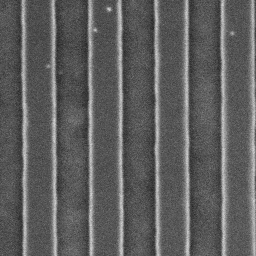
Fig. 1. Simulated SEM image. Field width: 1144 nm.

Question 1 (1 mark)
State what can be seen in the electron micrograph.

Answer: wiring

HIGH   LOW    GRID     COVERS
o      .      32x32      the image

...oooo....oooo....oooo.....oooo
...oooo....oooo....oooo.....oooo
...oooo....oooo....oooo.....oooo
...oooo....oooo....oooo.....oooo
...oooo....oooo....oooo.....oooo
...oooo....oooo....oooo.....oooo
...oooo....oooo....oooo.....oooo
...oooo....oooo....oooo.....oooo
...oooo....oooo....oooo.....oooo
...oooo....oooo....oooo.....oooo
...oooo....oooo....oooo.....oooo
...oooo....oooo....oooo.....oooo
...oooo....oooo.....ooo.....oooo
...oooo....oooo.....ooo.....oooo
...oooo....oooo.....ooo.....oooo
...oooo....oooo.....ooo.....oooo
...oooo....oooo.....ooo.....oooo
...oooo....oooo.....oooo....oooo
...oooo....oooo....ooooo....oooo
...oooo....oooo....oooo.....oooo
...oooo....oooo.....ooo.....oooo
...oooo....oooo.....oooo....oooo
...oooo....oooo.....oooo....oooo
...oooo....oooo.....oooo....oooo
...oooo....oooo.....oooo....oooo
...oooo....oooo.....oooo....oooo
...oooo....oooo.....oooo....oooo
...oooo....oooo.....oooo....oooo
...oooo....oooo.....oooo....oooo
...oooo....oooo.....oooo....oooo
...oooo....oooo.....oooo....oooo
...oooo....oooo.....oooo....oooo